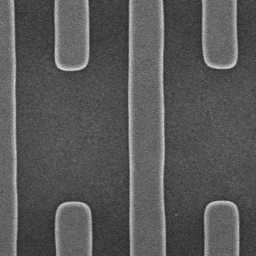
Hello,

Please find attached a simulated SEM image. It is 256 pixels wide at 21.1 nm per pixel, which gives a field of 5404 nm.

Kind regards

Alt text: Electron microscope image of groups of lines, slits or small figures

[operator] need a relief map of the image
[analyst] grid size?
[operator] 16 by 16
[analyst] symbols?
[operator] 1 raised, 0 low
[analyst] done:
1001110011000110
1001110011000110
1001110011000110
1001110011000110
1000000011000000
1000000011000000
1000000011000000
1000000011000000
1000000011000000
1000000011000000
1000000011000000
1000000011000000
1000000011000000
1001110011000110
1001110011000110
1001110011000110